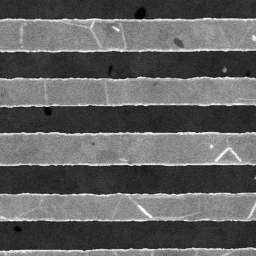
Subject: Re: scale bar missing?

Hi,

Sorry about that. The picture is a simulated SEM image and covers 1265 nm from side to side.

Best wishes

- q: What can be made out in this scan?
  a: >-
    lines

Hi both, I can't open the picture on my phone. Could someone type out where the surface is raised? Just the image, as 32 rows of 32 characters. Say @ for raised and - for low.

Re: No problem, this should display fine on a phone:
--------------------------------
--------------------------------
@@@-@---@@-@@----@@@@-@-@@@@@@@@
@@@@@@@@@@@@@@@@@@@@@@@@@@@@@@@@
@@@@@@@@@@@@@@@@@@@@@@@@@@@@@@@@
@@@@@@@@@@@@@@@@@@@@@@@@@@@@@@@@
--------------------------------
--------------------------------
--------------------------------
--------------------------------
@@@@@@@@@@@@@@@@@@@@@@@@@@@@@@@@
@@@@@@@@@@@@@@@@@@@@@@@@@@@@@@@@
@@@@@@@@@@@@@@@@@@@@@@@@@@@@@@@@
--------------------------------
--------------------------------
--------------------------------
--------------------------------
@@@@@@@@@@@@@@@@@@@@@@@@@@@@@@@@
@@@@@@@@@@@@@@@@@@@@@@@@@@@@@@@@
@@@@@@@@@@@@@@@@@@@@@@@@@@@@@@@@
@@@@@@@@@@@@@@@@@@@@@@@@@@@@@@@@
--------------------------------
--------------------------------
--------------------------------
@@@@@@@@@@@@@@@@@@@@@@@@@@@@@@@@
@@@@@@@@@@@@@@@@@@@@@@@@@@@@@@@@
@@@@@@@@@@@@@@@@@@@@@@@@@@@@@@@@
@@@@@@@@@@@@@@@@@@@--@-@@-@@@@@@
--------------------------------
--------------------------------
--------------------------------
@@@@@@@@@@@@@@@@@@@@@@@@@@@@@@@@